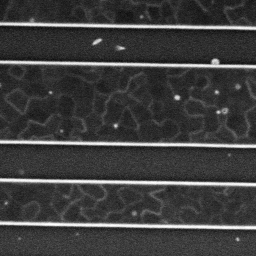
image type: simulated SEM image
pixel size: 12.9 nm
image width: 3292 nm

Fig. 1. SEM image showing groups of lines, slits or small figures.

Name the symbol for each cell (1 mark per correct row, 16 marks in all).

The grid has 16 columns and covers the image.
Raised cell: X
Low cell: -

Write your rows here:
XXXXXXXXXXXXXXXX
XXXXXXXXXXXXXXXX
----------------
----------------
XXXXXXXXXXXXXXXX
XXXXXXXXXXXXXXXX
XXXXXXXXXXXXXXXX
XXXXXXXXXXXXXXXX
XXXXXXXXXXXXXXXX
----------------
----------------
XXXXXXXXXXXXXX--
XXXXXXXXXXXXXXXX
XXXXXXXXXXXXXXXX
----------------
----------------